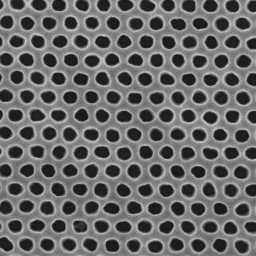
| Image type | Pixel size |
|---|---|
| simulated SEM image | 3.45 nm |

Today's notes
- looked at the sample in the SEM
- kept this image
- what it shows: a regular array of holes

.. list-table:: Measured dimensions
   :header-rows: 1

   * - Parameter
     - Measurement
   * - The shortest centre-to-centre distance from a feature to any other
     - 71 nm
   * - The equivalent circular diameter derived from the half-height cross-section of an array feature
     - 0.0461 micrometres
